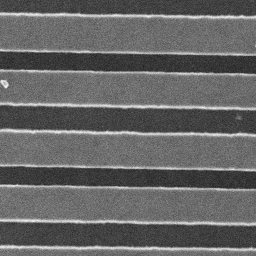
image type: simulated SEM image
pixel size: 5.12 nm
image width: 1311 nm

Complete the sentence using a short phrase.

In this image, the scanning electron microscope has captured lines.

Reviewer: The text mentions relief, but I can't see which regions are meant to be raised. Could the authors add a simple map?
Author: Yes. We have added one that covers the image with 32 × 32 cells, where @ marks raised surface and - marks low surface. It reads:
--------------------------------
--------------------------------
@@@@@@@@@@@@@@@@@@@@@@@@@@@@@@@@
@@@@@@@@@@@@@@@@@@@@@@@@@@@@@@@@
@@@@@@@@@@@@@@@@@@@@@@@@@@@@@@@@
@@@@@@@@@@@@@@@@@@@@@@@@@@@@@@@@
---------@-@@@@@@@@@@@@@@@@@@@@@
--------------------------------
--------------------------------
@@@@@@@@@@@@@@@@@@@@@@@@@@@@@@@@
@@@@@@@@@@@@@@@@@@@@@@@@@@@@@@@@
@@@@@@@@@@@@@@@@@@@@@@@@@@@@@@@@
@@@@@@@@@@@@@@@@@@@@@@@@@@@@@@@@
--------------------------@-@@@@
--------------------------------
--------------------------------
@@@@@@@@@@----------------------
@@@@@@@@@@@@@@@@@@@@@@@@@@@@@@@@
@@@@@@@@@@@@@@@@@@@@@@@@@@@@@@@@
@@@@@@@@@@@@@@@@@@@@@@@@@@@@@@@@
@@@@@@@@@@@@@@@@@@@@@@@@@@@@@@@@
--------------------------------
--------------------------------
@@@@@@@@@@@@@@@@@@@@@@@---------
@@@@@@@@@@@@@@@@@@@@@@@@@@@@@@@@
@@@@@@@@@@@@@@@@@@@@@@@@@@@@@@@@
@@@@@@@@@@@@@@@@@@@@@@@@@@@@@@@@
@@@@@@@@@@@@@@@@@@@@@@@@@@@@@@@@
--------------------------------
--------------------------------
--------------------------------
@@@@@@@@@@@@@@@@@@@@@@@@@@@@@@@@